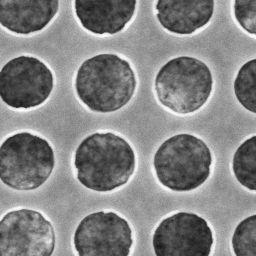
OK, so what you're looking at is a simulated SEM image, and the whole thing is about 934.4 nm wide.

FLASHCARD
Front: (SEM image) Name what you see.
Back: holes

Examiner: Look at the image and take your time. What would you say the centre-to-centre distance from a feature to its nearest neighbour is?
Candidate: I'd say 286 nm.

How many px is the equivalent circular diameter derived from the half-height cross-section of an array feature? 57.7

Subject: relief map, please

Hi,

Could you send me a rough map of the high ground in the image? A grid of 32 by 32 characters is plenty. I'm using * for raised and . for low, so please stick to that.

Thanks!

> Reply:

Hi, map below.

.......**........***.......**...
.......***.......***.......**...
......****......****......****..
*....******....******....*****..
********************************
********************************
********************************
*....******....*******...******.
......****......****......****..
.......***.......***......****..
.......**........**.......***...
......****.......***......***...
......****......****......****..
***********....******....******.
********************************
********************************
********************************
*....******....******....******.
......****......****......****..
.......**........**.......***...
.......**........**.......***...
......****.......***......***...
......****......****......****..
**...******...*******...*******.
********************************
********************************
*....*******.*******************
......****.....******....*****..
.......***......****......****..
.......**.......***........**...
.......**.......***.......***...
.......***......***.......***...